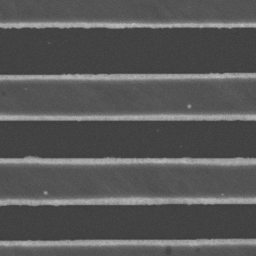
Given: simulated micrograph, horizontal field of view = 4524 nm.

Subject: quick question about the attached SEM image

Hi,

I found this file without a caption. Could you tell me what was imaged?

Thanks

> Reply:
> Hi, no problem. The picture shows lines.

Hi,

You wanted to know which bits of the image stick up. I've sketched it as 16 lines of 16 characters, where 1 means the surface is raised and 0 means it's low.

1111111111111111
1111111111111111
0000000000000000
0000000000000000
0000000000000000
1111111111111111
1111111111111111
0000000000000000
0000000000000000
0000000000000000
1111111111111111
1111111111111111
1111111111111111
0000000000000000
0000000000000000
1111111111111111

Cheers